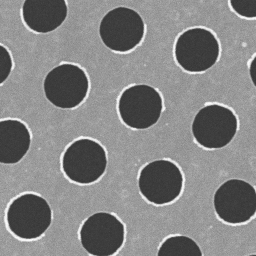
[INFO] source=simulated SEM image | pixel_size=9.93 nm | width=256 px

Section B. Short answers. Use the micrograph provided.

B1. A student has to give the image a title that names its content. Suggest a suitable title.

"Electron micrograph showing a regular array of holes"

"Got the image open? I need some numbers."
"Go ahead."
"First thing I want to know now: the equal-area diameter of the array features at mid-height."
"435 nanometers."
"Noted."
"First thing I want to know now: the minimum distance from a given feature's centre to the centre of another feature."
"0.769 µm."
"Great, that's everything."